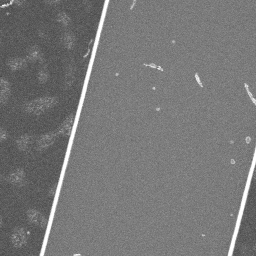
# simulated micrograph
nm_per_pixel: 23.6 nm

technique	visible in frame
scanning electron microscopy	one or a few lines or trenches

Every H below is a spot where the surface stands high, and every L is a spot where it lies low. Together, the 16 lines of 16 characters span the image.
HHHHHHHLLLLLLLLL
HHHHHHLLLLLLLLLL
HHHHHHLLLLLLLLLL
HHHHHHLLLLLLLLLL
HHHHHHLLLLLLLLLL
HHHHHLLLLLLLLLLL
HHHHHLLLLLLLLLLL
HHHHHLLLLLLLLLLL
HHHHHLLLLLLLLLLL
HHHHLLLLLLLLLLLL
HHHHLLLLLLLLLLLL
HHHHLLLLLLLLLLLH
HHHHLLLLLLLLLLLH
HHHLLLLLLLLLLLLH
HHHLLLLLLLLLLLLH
HHHLLLLLLLLLLLHH